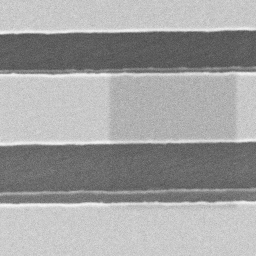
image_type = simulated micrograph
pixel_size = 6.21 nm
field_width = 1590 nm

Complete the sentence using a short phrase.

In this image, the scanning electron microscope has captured lines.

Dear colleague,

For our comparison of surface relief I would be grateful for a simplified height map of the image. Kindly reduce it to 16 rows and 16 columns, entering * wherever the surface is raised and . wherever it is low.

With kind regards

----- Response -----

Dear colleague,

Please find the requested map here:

****************
****************
................
................
..............*.
****************
****************
****************
****************
................
................
................
................
****************
****************
****************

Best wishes